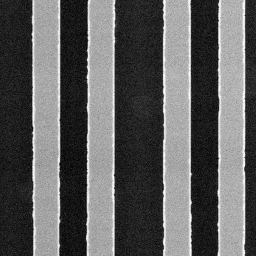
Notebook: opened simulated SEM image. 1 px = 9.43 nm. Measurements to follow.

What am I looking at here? lines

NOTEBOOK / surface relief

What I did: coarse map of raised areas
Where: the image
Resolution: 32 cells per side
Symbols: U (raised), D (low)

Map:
DDDDUUUDDDDUUUDDDDDDUUUUDDDUUUUD
DDDDUUUDDDDUUUDDDDDDUUUUDDDUUUUD
DDDDUUUDDDDUUUDDDDDDUUUUDDDUUUUD
DDDDUUUDDDDUUUDDDDDDUUUUDDDUUUUD
DDDDUUUDDDDUUUDDDDDDUUUUDDDUUUUD
DDDDUUUDDDDUUUDDDDDDUUUUDDDUUUUD
DDDDUUUDDDDUUUDDDDDDUUUUDDDUUUUD
DDDDUUUDDDDUUUDDDDDDUUUUDDDUUUUD
DDDDUUUDDDDUUUDDDDDDUUUUDDDUUUUD
DDDDUUUDDDDUUUDDDDDDUUUUDDDUUUUD
DDDDUUUDDDDUUUDDDDDDUUUUDDDUUUUD
DDDDUUUDDDDUUUDDDDDDUUUUDDDUUUUD
DDDDUUUDDDDUUUDDDDDDUUUUDDDUUUUD
DDDDUUUDDDDUUUDDDDDDUUUUDDDUUUUD
DDDDUUUDDDDUUUDDDDDDUUUUDDDUUUUD
DDDDUUUDDDDUUUDDDDDDUUUUDDDUUUUD
DDDDUUUDDDDUUUDDDDDDDUUUDDDUUUUD
DDDDUUUDDDDUUUDDDDDDUUUUDDDUUUUD
DDDDUUUDDDDUUUDDDDDDUUUUDDDUUUUD
DDDDUUUDDDDUUUDDDDDDUUUUDDDUUUUD
DDDDUUUDDDDUUUDDDDDDUUUUDDDUUUUD
DDDDUUUDDDDUUUDDDDDDUUUUDDDUUUUD
DDDDUUUDDDDUUUDDDDDDUUUUDDDUUUUD
DDDDUUUDDDDUUUDDDDDDUUUUDDDUUUUD
DDDDUUUDDDDUUUDDDDDDUUUUDDDUUUUD
DDDDUUUDDDDUUUDDDDDDUUUUDDDUUUUD
DDDDUUUDDDDUUUDDDDDDUUUUDDDUUUUD
DDDDUUUDDDDUUUDDDDDDUUUUDDDUUUUD
DDDDUUUDDDDUUUDDDDDDUUUUDDDUUUUD
DDDDUUUDDDDUUUDDDDDDUUUUDDDUUUUD
DDDDUUUDDDDUUUDDDDDDUUUUDDDUUUUD
DDDDUUUDDDDUUUDDDDDDUUUUDDDUUUUD